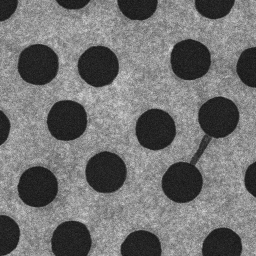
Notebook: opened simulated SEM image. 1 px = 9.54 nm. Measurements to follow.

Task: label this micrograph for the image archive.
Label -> a regular array of holes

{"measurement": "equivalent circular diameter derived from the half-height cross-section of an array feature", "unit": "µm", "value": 0.392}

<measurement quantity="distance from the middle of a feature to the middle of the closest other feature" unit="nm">595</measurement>